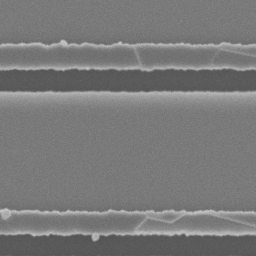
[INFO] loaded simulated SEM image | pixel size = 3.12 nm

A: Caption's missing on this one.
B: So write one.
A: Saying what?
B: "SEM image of lines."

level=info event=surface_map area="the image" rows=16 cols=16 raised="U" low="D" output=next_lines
UUUUUUUUUUUUUUUU
UUUUUUUUUUUUUUUU
UUUUUUUUUUUUUUUU
UUUUUUUUUUUUUUUU
DDDDDDDDDDDDDDDD
DDDDDDDDDDDDDDDD
UUUUUUUUUUUUUUUU
UUUUUUUUUUUUUUUU
UUUUUUUUUUUUUUUU
UUUUUUUUUUUUUUUU
UUUUUUUUUUUUUUUU
UUUUUUUUUUUUUUUU
UUUUUUUUUUUUUUUU
UUUUUUUUUUUUUUUU
UUUUUUUUUUUUUUUU
DDDDDDDDDDDDDDDD